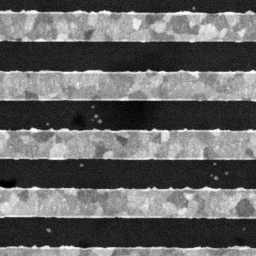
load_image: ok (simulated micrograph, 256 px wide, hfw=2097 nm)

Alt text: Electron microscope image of lines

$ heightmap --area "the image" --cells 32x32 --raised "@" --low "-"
--------------------------------
--------------------------------
@@@@@@@@@@@@@@@@@@@@@@@@@@@@@@@@
@@@@@@@@@@@@@@@@@@@@@@@@@@@@@@@@
@@@@@@@@@@@@@@@@@@@@@@@@@@@@@@@@
--------------------------------
--------------------------------
--------------------------------
--------------------------------
@@@@@@@@@@@@@@@@@@@@@@@@@@@@@@@@
@@@@@@@@@@@@@@@@@@@@@@@@@@@@@@@@
@@@@@@@@@@@@@@@@@@@@@@@@@@@@@@@@
-------------------------@--@--@
--------------------------------
--------------------------------
--------------------------------
@@@@@@@@@@@@@@@@@@@@@@@@@@@@@@@@
@@@@@@@@@@@@@@@@@@@@@@@@@@@@@@@@
@@@@@@@@@@@@@@@@@@@@@@@@@@@@@@@@
@@@@@@@@@@@@@@@@@@@@@@@@@@@@@@@@
--------------------------------
--------------------------------
--------------------------------
--------------------------------
@@@@@@@@@@@@@@@@@@@@@@@@@@@@@@@@
@@@@@@@@@@@@@@@@@@@@@@@@@@@@@@@@
@@@@@@@@@@@@@@@@@@@@@@@@@@@@@@@@
--------------------------------
--------------------------------
--------------------------------
--------------------------------
@@@@@@@@@@@@@@@@@@@@@@@@@@@@@@@@